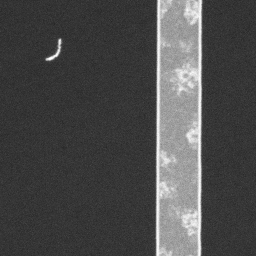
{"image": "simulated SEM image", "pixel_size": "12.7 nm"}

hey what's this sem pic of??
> one or a few lines or trenches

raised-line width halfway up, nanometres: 538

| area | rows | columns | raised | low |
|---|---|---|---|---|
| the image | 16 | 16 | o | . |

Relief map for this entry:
..........oo....
..........oo....
..........oo....
..........oo....
..........oo....
..........ooo...
..........ooo...
..........oo....
..........ooo...
..........oo....
..........ooo...
..........ooo...
..........oo....
..........oo....
..........oo....
..........oo....